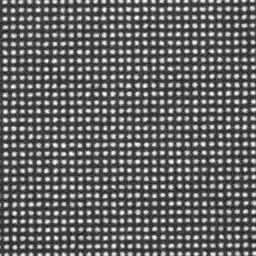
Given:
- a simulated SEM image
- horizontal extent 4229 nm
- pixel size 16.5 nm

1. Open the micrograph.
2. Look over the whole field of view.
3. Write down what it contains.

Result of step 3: a regular array of raised bodies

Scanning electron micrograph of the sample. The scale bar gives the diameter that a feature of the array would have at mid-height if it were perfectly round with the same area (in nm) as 58.9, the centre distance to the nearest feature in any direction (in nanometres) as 132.